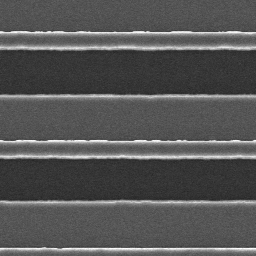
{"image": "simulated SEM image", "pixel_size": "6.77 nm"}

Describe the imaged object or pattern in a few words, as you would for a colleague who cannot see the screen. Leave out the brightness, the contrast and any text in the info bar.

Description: lines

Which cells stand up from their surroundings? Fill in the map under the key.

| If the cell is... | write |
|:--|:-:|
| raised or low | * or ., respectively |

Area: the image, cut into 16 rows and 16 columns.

****************
****************
****************
................
................
................
****************
****************
****************
****************
................
................
................
****************
****************
****************